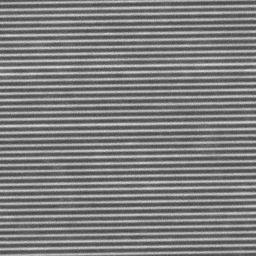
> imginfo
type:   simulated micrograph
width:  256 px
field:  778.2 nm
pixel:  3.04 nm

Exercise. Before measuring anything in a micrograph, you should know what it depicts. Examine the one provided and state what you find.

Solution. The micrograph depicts parallel lines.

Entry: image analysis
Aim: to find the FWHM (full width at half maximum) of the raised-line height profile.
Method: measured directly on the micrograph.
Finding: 0.0049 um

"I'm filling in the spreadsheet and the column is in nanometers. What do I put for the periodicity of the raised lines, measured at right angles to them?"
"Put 19.7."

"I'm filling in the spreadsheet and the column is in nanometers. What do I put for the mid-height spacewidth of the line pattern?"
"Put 15.6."